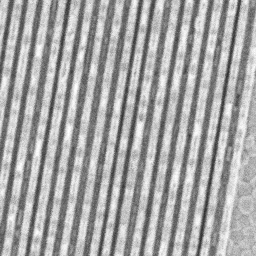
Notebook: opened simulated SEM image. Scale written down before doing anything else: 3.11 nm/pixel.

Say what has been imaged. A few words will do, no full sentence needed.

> parallel lines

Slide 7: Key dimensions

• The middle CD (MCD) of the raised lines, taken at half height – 0.0238 microns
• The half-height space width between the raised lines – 0.0211 µm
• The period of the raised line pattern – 43.9 nm